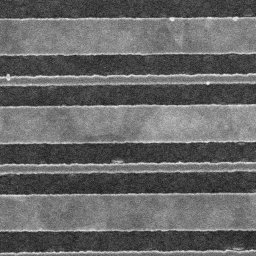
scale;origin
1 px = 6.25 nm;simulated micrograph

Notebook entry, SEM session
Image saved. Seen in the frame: lines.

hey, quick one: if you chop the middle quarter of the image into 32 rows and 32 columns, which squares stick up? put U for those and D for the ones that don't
DDDDDDDDDDDDDDDDDDDDDDDDDDDDDDDD
DDDDDDDDDDDDDDDDDDDDDDDDDDDDDDDD
DDDDDDDDDDDDDUDDDDDDDDDDDDDDDDDD
UUUUUUUUUUUUUUUUUUUUUUUUUUUUUUUU
UUUUUUUUUUUUUUUUUUUUUUUUUUUUUUUU
DDDDDDDDDDDDDDDDDDDDDDDDDDDDDDDD
DDDDDDDDDDDDDDDDDDDDDDDDDDDDDDDD
DDDDDUDDDUDDDDDDDDDDDDDDDDDDDDDD
DDDDDUDDDDDDDDDDDDDDDDDDDDDDDDDD
DDDDDDDDDDDDDDDDDDDDDDDDDDDDDDDD
DDDDDDDDDDDDDDUDUDUUUUUUUUUUDUUU
UUUUUUUUUUUUUUUUUUUUUUUUUUUUUUUU
UUUUUUUUUUUUUUUUUUUUUUUUUUUUUUUU
UUUUUUUUUUUUUUUUUUUUUUUUUUUUUUUU
UUUUUUUUUUUUUUUUUUUUUUUUUUUUUUUU
UUUUUUUUUUUUUUUUUUUUUUUUUUUUUUUU
UUUUUUUUUUUUUUUUUUUUUUUUUUUUUUUU
UUUUUUUUUUUUUUUUUUUUUUUUUUUUUUUU
UUUUUUUUUUUUUUUUUUUUUUUUUUUUUUUU
UUUUUUUUUUUUUUUUUUUUUUUUDUDUUUUU
DDDDDDDDDDDDDDDDDDDDDDDDDDDDDDDD
DDDDDDDDDDDDDDDDDDDDDDDDDDDDDDDD
DDDDDDDDDDDDDDDDDDDDDDDDDDDDDDDD
DDDDDDDDDDDDDDDDDDDDDDDDDDDDDDDD
DDDDDDDDDDDDDUUDDDDDDDDDDDDDDDDD
UUUUUUUUUUUUUUUUUUUUUUUUUUUUUUUU
UUUUUUUUUUUUUUUUUUUUUUUUUUUUUUUU
DDDDDDDDDDDDDDDDDDDDDDDDDDDDDDDD
DUUDDDDDDDDDDDDDDDDDDDDDDDDDDDDD
DDDDDDDDDDDDDDDDDDDDDUUDDDDDDDDD
DDDDDDDDDDDDDDDDDDDDDDDDDDDUDDDD
DDDDDDDDDDDDDDDDDDDDDDDDDDDDDDDD